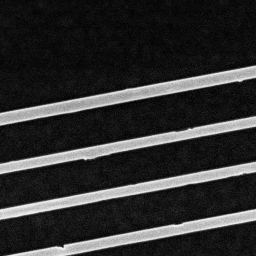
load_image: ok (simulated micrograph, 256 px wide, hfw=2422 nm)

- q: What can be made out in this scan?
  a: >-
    parallel lines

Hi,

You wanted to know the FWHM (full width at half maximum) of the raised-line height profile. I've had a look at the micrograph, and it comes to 88.4 nanometres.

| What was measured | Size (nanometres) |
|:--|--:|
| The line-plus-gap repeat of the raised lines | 443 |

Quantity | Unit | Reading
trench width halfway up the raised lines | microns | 0.352